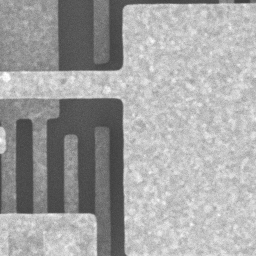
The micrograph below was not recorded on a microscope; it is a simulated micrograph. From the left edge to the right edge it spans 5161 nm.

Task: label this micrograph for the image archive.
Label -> wiring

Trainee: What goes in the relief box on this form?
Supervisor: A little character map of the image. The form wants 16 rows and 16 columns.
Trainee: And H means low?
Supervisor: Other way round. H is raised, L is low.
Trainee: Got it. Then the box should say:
LLLLLLLLHHHHHHHH
LLLLLLLLHHHHHHHH
LLLLLLLLHHHHHHHH
LLLLLLLLHHHHHHHH
LLLHHHHHHHHHHHHH
HHHHHHHHHHHHHHHH
LLLLLLLLHHHHHHHH
LLLLLLLLHHHHHHHH
LLLLLLLLHHHHHHHH
LLLLLLLLHHHHHHHH
LLLLLLLLHHHHHHHH
LLLLLLLLHHHHHHHH
LLLLLLLLHHHHHHHH
HHHHHHLLHHHHHHHH
HHHHHHLLHHHHHHHH
HHHHHHLLHHHHHHHH